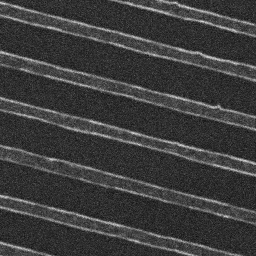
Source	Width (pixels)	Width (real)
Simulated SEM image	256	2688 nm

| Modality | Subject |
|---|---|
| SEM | parallel lines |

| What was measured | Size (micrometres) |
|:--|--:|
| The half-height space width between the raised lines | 0.361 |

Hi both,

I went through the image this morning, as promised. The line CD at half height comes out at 11.8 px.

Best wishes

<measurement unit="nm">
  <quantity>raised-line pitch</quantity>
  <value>484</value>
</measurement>